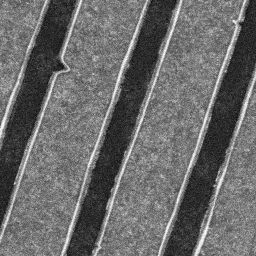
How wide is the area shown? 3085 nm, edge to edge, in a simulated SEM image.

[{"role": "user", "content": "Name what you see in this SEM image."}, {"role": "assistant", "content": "one or a few lines or trenches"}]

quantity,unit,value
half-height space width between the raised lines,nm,412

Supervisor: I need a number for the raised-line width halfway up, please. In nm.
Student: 743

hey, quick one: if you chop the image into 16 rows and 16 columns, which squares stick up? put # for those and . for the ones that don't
###..####..####.
##...####..####.
##..####...####.
##..####..####..
#...####..####..
#..####...###...
#..####..####..#
...####..####..#
..####..#####..#
..####..####..##
.#####..####..##
.####..####...##
.####..####..###
.####..####..###
####..####...###
####..####..####